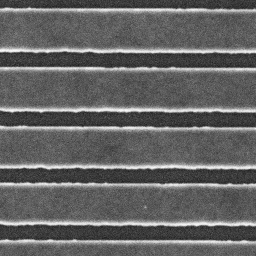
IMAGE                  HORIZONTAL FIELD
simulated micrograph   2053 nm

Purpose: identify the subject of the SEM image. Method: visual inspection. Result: lines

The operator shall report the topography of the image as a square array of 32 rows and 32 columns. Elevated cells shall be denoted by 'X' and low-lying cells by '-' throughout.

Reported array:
--------------------------------
XXXXXXXXXXXXXXXXXXXXXXXXXXXXXXXX
XXXXXXXXXXXXXXXXXXXXXXXXXXXXXXXX
XXXXXXXXXXXXXXXXXXXXXXXXXXXXXXXX
XXXXXXXXXXXXXXXXXXXXXXXXXXXXXXXX
XXXXXXXXXXXXXXXXXXXXXXXXXXXXXXXX
----X-------XX--XXXXXXXXXXXXXXXX
--------------------------------
XXXXXXXXXXXXX--X-XXX-X----------
XXXXXXXXXXXXXXXXXXXXXXXXXXXXXXXX
XXXXXXXXXXXXXXXXXXXXXXXXXXXXXXXX
XXXXXXXXXXXXXXXXXXXXXXXXXXXXXXXX
XXXXXXXXXXXXXXXXXXXXXXXXXXXXXXXX
XXXXXXXXXXXXXXXXXXXXXXXXXXXXXXXX
--------------------------------
--------------------------------
XXXXXXXXXXXXXXXXXXXXXXXXXXXXXXXX
XXXXXXXXXXXXXXXXXXXXXXXXXXXXXXXX
XXXXXXXXXXXXXXXXXXXXXXXXXXXXXXXX
XXXXXXXXXXXXXXXXXXXXXXXXXXXXXXXX
XXXXXXXXXXXXXXXXXXXXXXXXXXXXXXXX
--------------------------------
--------------------------------
XXXXXXXXXXXXXXXXXXXXXXXXXXXXXXXX
XXXXXXXXXXXXXXXXXXXXXXXXXXXXXXXX
XXXXXXXXXXXXXXXXXXXXXXXXXXXXXXXX
XXXXXXXXXXXXXXXXXXXXXXXXXXXXXXXX
XXXXXXXXXXXXXXXXXXXXXXXXXXXXXXXX
--------------------------------
--------------------------------
XXXXXXXXXXXXXXXXXXXXXXXXXXXXXXXX
XXXXXXXXXXXXXXXXXXXXXXXXXXXXXXXX